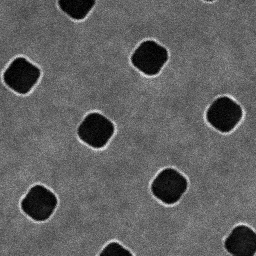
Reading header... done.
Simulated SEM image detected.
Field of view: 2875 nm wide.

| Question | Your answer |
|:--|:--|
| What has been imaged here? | holes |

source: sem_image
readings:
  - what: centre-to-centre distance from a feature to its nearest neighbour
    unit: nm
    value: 1010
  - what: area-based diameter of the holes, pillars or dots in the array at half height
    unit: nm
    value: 397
